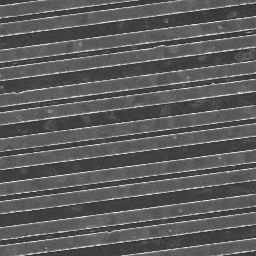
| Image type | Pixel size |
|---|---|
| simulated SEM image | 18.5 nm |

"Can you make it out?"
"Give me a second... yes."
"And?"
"parallel lines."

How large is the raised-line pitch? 406 nm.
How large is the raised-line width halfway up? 246 nm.